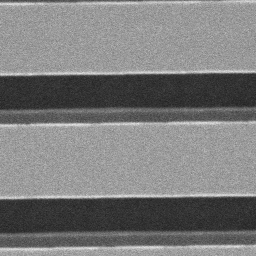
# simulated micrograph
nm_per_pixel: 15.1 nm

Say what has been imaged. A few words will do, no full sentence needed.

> lines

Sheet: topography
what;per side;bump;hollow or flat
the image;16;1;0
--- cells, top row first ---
1111111111111111
1111111111111111
1111111111111111
1111111111111111
1111111111111111
0000000000000000
0000000000000000
0000000000000000
1111111111111111
1111111111111111
1111111111111111
1111111111111111
0000000000000000
0000000000000000
0000000000000000
0001111111111111